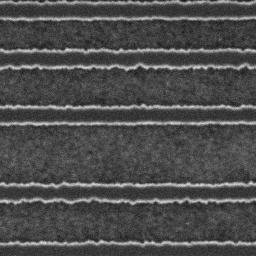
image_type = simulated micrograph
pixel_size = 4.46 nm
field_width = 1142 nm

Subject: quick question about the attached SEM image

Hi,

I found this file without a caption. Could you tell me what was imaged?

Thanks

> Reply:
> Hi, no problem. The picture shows lines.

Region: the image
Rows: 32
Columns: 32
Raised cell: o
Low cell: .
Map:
oooooooooooooooooooooooooooooooo
oooooooooooooooooooooooooooooooo
.o.o...o..oo....o...............
................................
................................
................................
oooooooooooooooooooooooooooooooo
oooooooooooooooooooooooooooooooo
o.o..oooo.o.oo.oo....oo.o....o.o
................................
................................
................................
................................
oooooooooooooooooooooooooooooooo
oooooooooooooooooooooooooooooooo
ooo.ooo..o.o.o..o...............
................................
................................
................................
................................
................................
................................
................................
oooooooooooooooooooooooooooooooo
oooooooooooooooooooooooooooooooo
................................
................................
................................
................................
................................
oooooooooooooooooooooooooooooooo
oooooooooooooooooooooooooooooooo